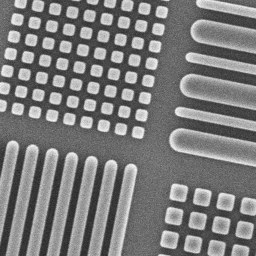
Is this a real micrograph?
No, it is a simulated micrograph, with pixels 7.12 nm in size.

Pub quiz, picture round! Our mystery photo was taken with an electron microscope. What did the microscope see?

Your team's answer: groups of lines, slits or small figures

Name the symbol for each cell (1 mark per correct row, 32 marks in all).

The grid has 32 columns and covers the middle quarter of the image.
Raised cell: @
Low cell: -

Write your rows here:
@--@@--@@-----------@@@---------
---@@--@@@-@@@------------------
-------@@--@@@--@@--------------
-----------@@@-@@@--@@--------@@
--@@------------@@--@@-------@@@
--@@--@@@--@---------@-------@@@
---@--@@@-@@@--@@------------@@@
----------@@@-@@@--@@---------@@
-@@-----------@@@--@@@----------
-@@--@@@-----------@@-----------
-@@--@@@-@@@--------------------
------@--@@@--@@--@@--------@@@@
@-------------@@--@@@-------@@@@
@@@--@@-----------@@@----------@
@@@-@@@--@@---------------------
----@@@--@@--@@@----------------
---------@@--@@@-@@@--------@@@@
-------------@@--@@@-------@@@@@
---------------------------@@@@@
---------------------------@@@@@
---------------------------@@@@@
----------------------------@@@@
-@@-----------------------------
@@@---@@------------------------
@@@--@@@---@@-------------------
@@@--@@@--@@@---@@--------------
@@@--@@@--@@@--@@@--------------
@@@--@@@--@@@--@@@--------------
@@---@@@--@@@--@@@--------------
@@--@@@---@@---@@@--------------
@@--@@@--@@@--@@@----------@@@--
@@--@@@--@@@--@@@----------@@@@-